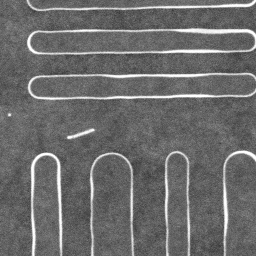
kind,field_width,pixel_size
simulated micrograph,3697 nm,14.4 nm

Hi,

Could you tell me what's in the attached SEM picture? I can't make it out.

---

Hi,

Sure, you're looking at groups of lines, slits or small figures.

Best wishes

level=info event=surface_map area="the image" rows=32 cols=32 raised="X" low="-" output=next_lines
----XXXXXXXXXXXXXXXXXXXXXXXXXXX-
--------------------------------
--------------------------------
--------------------------------
----XXXXXXXXXXXXXXXXXXXXXXXXXXXX
----XXXXXXXXXXXXXXXXXXXXXXXXXXXX
----XXXXXXXXXXXXXXXXX-----------
--------------------------------
--------------------------------
------XXXXXXXX--XXXXXXXXXXXXXXXX
----XXXXXXXXXXXXXXXXXXXXXXXXXXXX
----XXXXXXXXXXXXXXXXXXXXXXXXXXXX
--------------------------------
--------------------------------
--------------------------------
--------------------------------
--------------------------------
--------------------------------
--------------------------------
-----XX------XX------XX------XXX
----XXX-----XXXX-----XX-----XXXX
----XXX----XXXXX-----XX-----XXXX
----XXX----XXXXX-----XX-----XXXX
----XXX-----XXXX-----XX-----XXXX
----XXX----XXXXX-----XX-----XXXX
----XXX----XXXXX-----XX-----XXXX
----XXX----XXXXX-----XX-----XXXX
----XXXX---XXXXX-----XXX----XXXX
----XXXX---XXXXX-----XXX----XXXX
----XXXX----XXXXX----XXX----XXXX
----XXXX----XXXXX----XXX----XXXX
----XXXX----XXXXX----XXX----XXXX